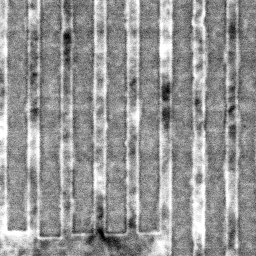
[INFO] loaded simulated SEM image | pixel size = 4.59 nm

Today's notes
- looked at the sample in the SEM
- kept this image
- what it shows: parallel lines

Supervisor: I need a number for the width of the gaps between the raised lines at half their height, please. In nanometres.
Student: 100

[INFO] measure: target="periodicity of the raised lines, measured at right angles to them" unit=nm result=151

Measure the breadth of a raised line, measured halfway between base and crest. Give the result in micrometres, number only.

0.0499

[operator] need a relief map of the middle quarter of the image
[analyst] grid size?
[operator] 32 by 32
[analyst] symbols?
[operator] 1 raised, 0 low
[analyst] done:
11000000110000001100000011100000
11000000110000001100000011100000
11000000110000001100000011100000
11000000110000001100000011100000
11000000110000001100000011100000
11000000110000001110000011100000
11000000110000001100000011100000
11000000110000001100000011100000
11000000110000001100000011100000
11000000110000001110000011100000
11000000110000001100000011100000
11000000110000001100000011100000
11000000110000001100000011100000
11000000110000001100000011100000
11000000110000001100000011100000
11000000111000001100000011100000
11000000110000001100000011100000
11000000110000001110000011100000
11000000110000001110000011100000
11000000110000011100010011100000
11000000110000001100100011100000
11000000110000001100000011100000
11000001110000001100000011100000
11000000110000001100000011100000
11000000110000001100000011100000
11000000110000001100000011100000
11000000110000001100000011100000
11000000110000001110000011100000
11000000110000001100000011100000
11000000110000001100000011100000
11000000110000001110000011100000
11000000110000001100000011100000